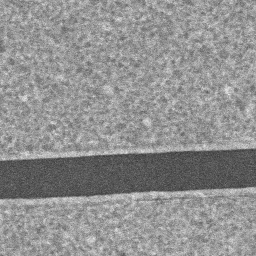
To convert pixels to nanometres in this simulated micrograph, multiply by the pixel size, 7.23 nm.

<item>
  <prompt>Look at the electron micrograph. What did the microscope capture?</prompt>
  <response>one or a few lines or trenches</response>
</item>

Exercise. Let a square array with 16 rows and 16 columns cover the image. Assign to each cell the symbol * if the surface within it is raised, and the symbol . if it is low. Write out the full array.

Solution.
****************
****************
****************
****************
****************
****************
****************
****************
****************
*******.........
................
................
.....***********
****************
****************
****************